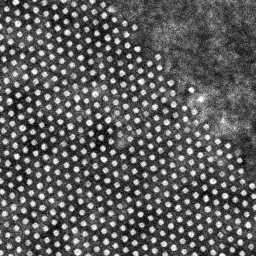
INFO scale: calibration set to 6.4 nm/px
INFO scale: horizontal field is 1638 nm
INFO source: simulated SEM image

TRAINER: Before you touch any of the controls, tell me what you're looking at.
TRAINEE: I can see a regular array of raised bodies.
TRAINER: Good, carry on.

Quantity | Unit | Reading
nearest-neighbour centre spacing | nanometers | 67.3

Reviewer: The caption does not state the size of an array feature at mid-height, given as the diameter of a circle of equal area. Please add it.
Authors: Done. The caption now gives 30.6 nm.